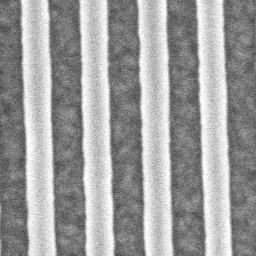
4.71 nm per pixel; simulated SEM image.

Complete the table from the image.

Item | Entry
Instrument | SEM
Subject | lines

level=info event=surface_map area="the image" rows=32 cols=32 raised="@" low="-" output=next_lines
---@@@----@@@----@@@@----@@@----
---@@@----@@@----@@@@----@@@----
---@@@----@@@----@@@@----@@@----
---@@@----@@@----@@@@----@@@----
---@@@----@@@----@@@@----@@@----
---@@@----@@@-----@@@----@@@----
---@@@----@@@-----@@@----@@@----
---@@@----@@@----@@@@----@@@----
---@@@----@@@----@@@@----@@@----
---@@@----@@@----@@@@----@@@----
---@@@----@@@@----@@@----@@@----
---@@@----@@@@----@@@----@@@----
---@@@----@@@@----@@@----@@@----
---@@@----@@@@----@@@----@@@----
---@@@----@@@@----@@@----@@@----
---@@@----@@@@----@@@----@@@----
---@@@----@@@@----@@@----@@@----
---@@@----@@@@----@@@----@@@----
---@@@----@@@@----@@@----@@@----
---@@@-----@@@----@@@----@@@----
---@@@-----@@@----@@@----@@@@---
---@@@@----@@@----@@@----@@@@---
---@@@@---@@@@----@@@----@@@@---
---@@@@----@@@----@@@----@@@@---
---@@@@----@@@----@@@-----@@@---
---@@@@----@@@----@@@-----@@@---
----@@@----@@@----@@@-----@@@---
---@@@@----@@@----@@@-----@@@---
----@@@----@@@----@@@-----@@@---
----@@@----@@@----@@@-----@@@---
----@@@----@@@----@@@@----@@@---
----@@@----@@@----@@@@----@@@---